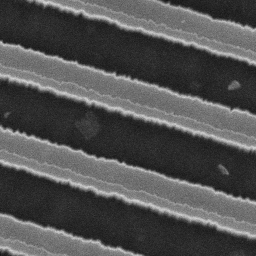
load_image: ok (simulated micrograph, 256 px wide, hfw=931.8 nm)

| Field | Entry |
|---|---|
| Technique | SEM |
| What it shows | lines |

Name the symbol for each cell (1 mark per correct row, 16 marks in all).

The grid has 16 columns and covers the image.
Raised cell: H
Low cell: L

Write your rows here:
LLLLHHHHHHHLLLLL
LLLLLLLHHHHHHHHL
LLLLLLLLLLLHHHHH
HHHLLLLLLLLLLLHH
HHHHHHLLLLLLLLLL
LLLHHHHHHHLLLLLL
LLLLLLHHHHHHHLLL
LLLLLLLLLLHHHHHH
HHLLLLLLLLLLLHHH
HHHHHLLLLLLLLLLL
LHHHHHHHLLLLLLLL
LLLLLHHHHHHHLLLL
LLLLLLLLHHHHHHHL
LLLLLLLLLLLHHHHH
HHHHLLLLLLLLLLLH
HHHHHHHLLLLLLLLL